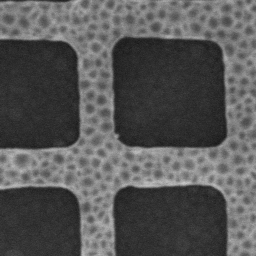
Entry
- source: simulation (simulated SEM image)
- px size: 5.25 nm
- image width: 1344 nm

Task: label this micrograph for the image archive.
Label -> holes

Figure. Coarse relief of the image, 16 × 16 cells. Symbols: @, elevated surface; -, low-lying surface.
@@@@@@@@@@@@@@@@
@@@@@@@@@@@@@@@@
---@@@@------@@@
-----@@-------@@
-----@@-------@@
-----@@-------@@
-----@@-------@@
-----@@-------@@
-----@@-------@@
@@@@@@@@@@@@@@@@
@@@@@@@@@@@@@@@@
@@@@@@@@@@@-@@@@
-----@@-------@@
-----@@-------@@
-----@@-------@@
-----@@-------@@